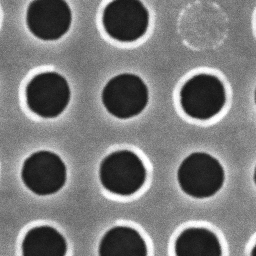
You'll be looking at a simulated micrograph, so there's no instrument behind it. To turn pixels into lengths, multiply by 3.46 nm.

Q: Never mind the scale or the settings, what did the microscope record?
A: holes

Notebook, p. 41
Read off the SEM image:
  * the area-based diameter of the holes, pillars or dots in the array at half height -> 159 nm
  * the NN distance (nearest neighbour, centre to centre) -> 268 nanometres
